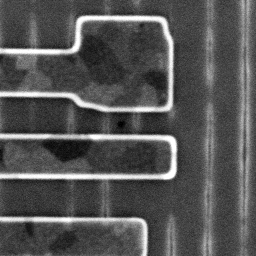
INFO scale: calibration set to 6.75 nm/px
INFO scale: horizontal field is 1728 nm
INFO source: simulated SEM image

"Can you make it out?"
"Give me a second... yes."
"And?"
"wiring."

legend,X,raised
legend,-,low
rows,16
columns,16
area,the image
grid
----------------
-----XXXXX------
-----XXXXXX-----
XXXXXXXXXXX-----
XXXXXXXXXXX-----
XXXXXXXXXXX-----
-----XXXXX------
----------------
----------------
XXXXXXXXXXX-----
XXXXXXXXXXX-----
----------------
----------------
----------------
XXXXXXXXX-------
XXXXXXXXX-------